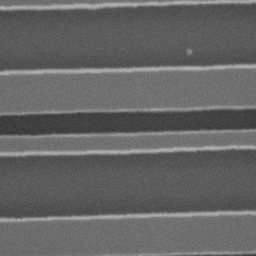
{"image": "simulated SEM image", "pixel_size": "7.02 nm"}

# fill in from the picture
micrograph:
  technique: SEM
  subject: lines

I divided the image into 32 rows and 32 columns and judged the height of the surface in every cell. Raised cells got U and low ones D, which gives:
UUUUUUUUUUUUUUUUUUDDDDDDDDDDDDDD
DDDDDDDDDDDDDDDDDDDDDDDDDDDDDDDD
DDDDDDDDDDDDDDDDDDDDDDDDDDDDDDDD
DDDDDDDDDDDDDDDDDDDDDDDDDDDDDDDD
DDDDDDDDDDDDDDDDDDDDDDDDDDDDDDDD
DDDDDDDDDDDDDDDDDDDDDDDDDDDDDDDD
DDDDDDDDDDDDDDDDDDDDDDDDDDDDDDDD
DDDDDDDDDDDDDDDDDDDDDDDDDDDDDDDD
DDDDDDDDDDDDDDDDDDDDDDDDDDUUUUUU
UUUUUUUUUUUUUUUUUUUUUUUUUUUUUUUU
UUUUUUUUUUUUUUUUUUUUUUUUUUUUUUUU
UUUUUUUUUUUUUUUUUUUUUUUUUUUUUUUU
UUUUUUUUUUUUUUUUUUUUUUUUUUUUUUUU
UUUUUUUUUUUUUUUUUUUUUUUUUUDDDDDD
DDDDDDDDDDDDDDDDDDDDDDDDDDDDDDDD
DDDDDDDDDDDDDDDDDDDDDDDDDDDDDDDD
DDDDDDDDDDDDDDDDDDDDDDDDDUUUUUUU
UUUUUUUUUUUUUUUUUUUUUUUUUUUUUUUU
UUUUUUUUUUUUUUUUUUUUUUUUUDDDDDDD
DDDDDDDDDDDDDDDDDDDDDDDDDDDDDDDD
DDDDDDDDDDDDDDDDDDDDDDDDDDDDDDDD
DDDDDDDDDDDDDDDDDDDDDDDDDDDDDDDD
DDDDDDDDDDDDDDDDDDDDDDDDDDDDDDDD
DDDDDDDDDDDDDDDDDDDDDDDDDDDDDDDD
DDDDDDDDDDDDDDDDDDDDDDDDDDDDDDDD
DDDDDDDDDDDDDDDDDDDDDDDDDDDDDDDD
DDDDDDDDDDDDDDDDDDDDDDDDDDDDDDDD
DDDDUUUUUUUUUUUUUUUUUUUUUUUUUUUU
UUUUUUUUUUUUUUUUUUUUUUUUUUUUUUUU
UUUUUUUUUUUUUUUUUUUUUUUUUUUUUUUU
UUUUUUUUUUUUUUUUUUUUUUUUUUUUUUUU
UUUUUUUUUUUUUUUUUUUUUUUUUUUUUUUU